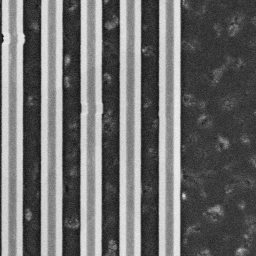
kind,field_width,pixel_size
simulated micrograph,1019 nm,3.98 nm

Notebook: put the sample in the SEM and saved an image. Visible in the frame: parallel lines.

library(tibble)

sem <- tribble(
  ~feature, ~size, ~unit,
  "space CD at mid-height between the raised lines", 94.4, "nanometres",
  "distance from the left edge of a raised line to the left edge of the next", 156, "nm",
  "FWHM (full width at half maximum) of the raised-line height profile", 60.6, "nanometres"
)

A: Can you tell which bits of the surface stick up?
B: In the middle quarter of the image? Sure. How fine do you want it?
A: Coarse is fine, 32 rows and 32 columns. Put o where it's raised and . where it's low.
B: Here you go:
.....oooo......ooo.......ooo....
.....oooo......ooo.......ooo....
.....oooo......ooo.......ooo....
.....oooo......ooo.......ooo....
.....oooo......ooo.......ooo....
.....oooo......ooo.......ooo....
.....oooo......ooo.......ooo....
.....oooo......ooo.......ooo....
.....oooo......ooo.......ooo....
.....oooo......ooo.......ooo....
.....oooo......ooo.......ooo....
.....oooo......ooo......oooo....
.....oooo......ooo......oooo....
.....oooo......ooo.......ooo....
.....oooo......ooo.......ooo....
.....oooo......ooo.......ooo....
.....oooo......ooo.......ooo....
.....oooo......ooo.......ooo....
.....oooo......ooo.......ooo....
.....oooo......ooo.......ooo....
.....oooo......ooo......oooo....
.....oooo......ooo......oooo....
.....oooo......ooo......oooo....
.....oooo......ooo.......ooo....
.....oooo......ooo.......ooo....
.....oooo......ooo......oooo....
.....oooo......ooo......oooo....
.....oooo......ooo.......ooo....
.....oooo......ooo.......ooo....
.....oooo......ooo.......ooo....
.....oooo......ooo.......ooo....
.....oooo......ooo.......ooo....